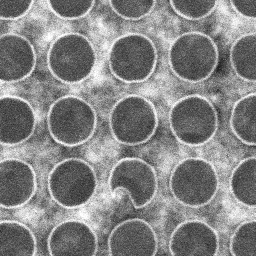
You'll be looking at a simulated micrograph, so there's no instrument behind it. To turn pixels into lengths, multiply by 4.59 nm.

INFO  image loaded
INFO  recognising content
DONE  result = a regular array of raised bodies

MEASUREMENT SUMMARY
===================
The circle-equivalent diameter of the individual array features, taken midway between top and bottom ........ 225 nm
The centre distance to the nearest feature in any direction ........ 0.278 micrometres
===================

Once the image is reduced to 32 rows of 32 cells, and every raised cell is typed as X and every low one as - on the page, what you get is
XXXX--XXXXXX--XXXXX--XXXXXX--XXX
XXX----XXXX---XXXXX---XXXX----XX
--------------------------------
--------------------------------
XXX-----XX-----XXX-----XXX----XX
XXXX---XXXX---XXXXX---XXXXX--XXX
XXXX--XXXXXX--XXXXX--XXXXXX--XXX
XXXX--XXXXXX--XXXXX--XXXXXX--XXX
XXXX--XXXXXX--XXXXX--XXXXXX--XXX
XXX----XXXX---XXXXX---XXXX----XX
--------------------------------
--------------------------------
XXX----XXX-----XXX-----XXX----XX
XXXX--XXXXX---XXXXX---XXXXX--XXX
XXXX--XXXXXX--XXXXXX-XXXXXX--XXX
XXXX--XXXXXX--XXXXXX-XXXXXX--XXX
XXXX--XXXXXX--XXXXX---XXXXX--XXX
XXX----XXXX----XXX----XXXX----XX
--------------------------------
--------------------------------
XXX----XXXX----XXX----XXXX----XX
XXXX--XXXXXX--XXXXX---XXXXX--XXX
XXXX--XXXXXX--XXXXXX-XXXXXX--XXX
XXXX--XXXXXX--XXXXXX-XXXXXX--XXX
XXXX--XXXXXX----XXX---XXXXX--XXX
XXX----XXXX------X-----XXX----XX
--------------------------------
----------------XX--------------
XXX----XXXX---XXXXX---XXXX----XX
XXXX--XXXXXX--XXXXX---XXXXX--XXX
XXXX--XXXXXX--XXXXXX-XXXXXX--XXX
XXXX--XXXXXX--XXXXX--XXXXXX--XXX